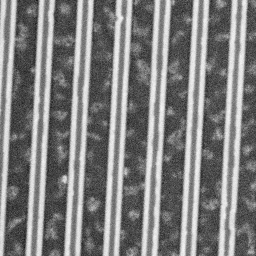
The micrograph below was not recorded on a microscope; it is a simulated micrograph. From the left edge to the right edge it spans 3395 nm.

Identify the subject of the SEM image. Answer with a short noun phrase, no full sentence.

parallel lines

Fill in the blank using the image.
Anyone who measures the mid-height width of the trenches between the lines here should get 359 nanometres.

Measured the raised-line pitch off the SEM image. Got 510 nm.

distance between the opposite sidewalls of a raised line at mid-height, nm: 144